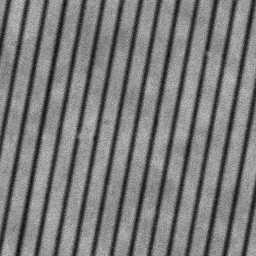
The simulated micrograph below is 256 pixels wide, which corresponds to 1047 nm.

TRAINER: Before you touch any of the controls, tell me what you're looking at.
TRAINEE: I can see parallel lines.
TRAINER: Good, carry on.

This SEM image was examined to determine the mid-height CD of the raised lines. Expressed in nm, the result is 55.2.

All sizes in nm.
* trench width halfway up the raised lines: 23.5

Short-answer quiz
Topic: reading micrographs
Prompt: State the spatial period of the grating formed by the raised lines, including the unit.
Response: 0.0757 micrometres